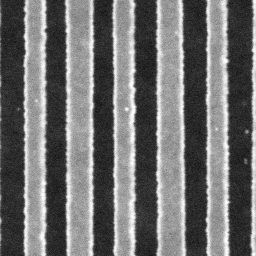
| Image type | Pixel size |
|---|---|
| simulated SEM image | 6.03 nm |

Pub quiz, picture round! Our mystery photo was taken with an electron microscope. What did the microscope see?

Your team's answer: lines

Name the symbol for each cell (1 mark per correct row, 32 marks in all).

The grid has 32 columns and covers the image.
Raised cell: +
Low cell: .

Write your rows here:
...+++..++++..+++...+++...++....
...+++..++++..+++...+++...++....
...+++..++++..+++...+++...++....
...++...++++..+++...+++...++....
...+++..++++..+++...+++...++....
...++...++++..+++...+++...++....
...++...++++..+++...+++...++....
...++...++++..+++...+++...++....
...++...++++..+++...+++...++....
...++...++++..+++...+++...++....
...++...++++..+++...+++...++....
...++...++++..+++...+++...++....
...++...++++..+++...+++...++....
...++...++++..+++...+++...++....
...++...++++..+++...+++...++....
...++...++++..+++...+++...++....
...++...++++..+++...+++...++....
...++...++++..+++...+++...++....
...++...++++..+++...+++...++....
...++...++++..+++...+++...++....
...++...++++..+++...+++...++....
...++...++++..+++...+++...++....
...++...++++..+++...+++...++....
...++...++++..+++...+++...++....
...++...++++..+++...+++...++....
...++...++++..+++...+++...++....
...+++..++++..+++...+++...++....
...++...++++..+++...+++...++....
...+++..++++..+++...+++...++....
...++...++++..+++...+++...++...+
...+++..++++..+++...+++...++...+
...+++..++++..+++...+++...++....